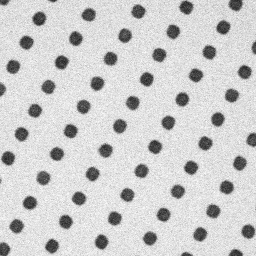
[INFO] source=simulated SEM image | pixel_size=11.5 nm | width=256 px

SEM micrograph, a regular array of holes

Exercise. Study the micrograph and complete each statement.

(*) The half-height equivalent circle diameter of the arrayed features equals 14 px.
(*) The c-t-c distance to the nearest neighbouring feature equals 312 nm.